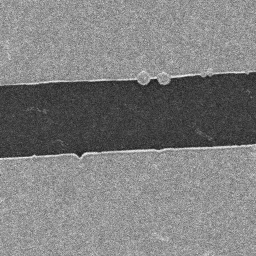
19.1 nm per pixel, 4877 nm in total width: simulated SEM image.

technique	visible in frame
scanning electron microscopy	one or a few lines or trenches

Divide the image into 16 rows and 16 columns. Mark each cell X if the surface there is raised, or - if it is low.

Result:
XXXXXXXXXXXXXXXX
XXXXXXXXXXXXXXXX
XXXXXXXXXXXXXXXX
XXXXXXXXXXXXXXXX
XXXXXXXXXXXXXXXX
----------------
----------------
----------------
----------------
-------XXXXXXXXX
XXXXXXXXXXXXXXXX
XXXXXXXXXXXXXXXX
XXXXXXXXXXXXXXXX
XXXXXXXXXXXXXXXX
XXXXXXXXXXXXXXXX
XXXXXXXXXXXXXXXX